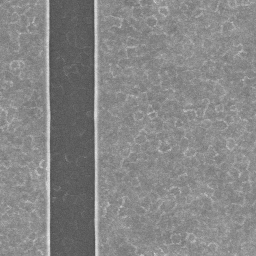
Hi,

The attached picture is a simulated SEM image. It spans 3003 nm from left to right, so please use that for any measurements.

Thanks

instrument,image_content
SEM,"one or a few lines or trenches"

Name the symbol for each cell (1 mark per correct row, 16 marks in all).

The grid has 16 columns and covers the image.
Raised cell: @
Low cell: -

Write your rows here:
@@@---@@@@@@@@@@
@@@---@@@@@@@@@@
@@@---@@@@@@@@@@
@@@---@@@@@@@@@@
@@@---@@@@@@@@@@
@@@---@@@@@@@@@@
@@@---@@@@@@@@@@
@@@---@@@@@@@@@@
@@@---@@@@@@@@@@
@@@---@@@@@@@@@@
@@@---@@@@@@@@@@
@@@---@@@@@@@@@@
@@@---@@@@@@@@@@
@@@---@@@@@@@@@@
@@@---@@@@@@@@@@
@@@---@@@@@@@@@@